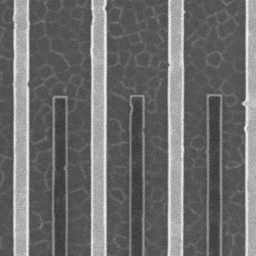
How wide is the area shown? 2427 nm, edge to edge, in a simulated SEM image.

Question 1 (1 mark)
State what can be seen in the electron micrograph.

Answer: parallel lines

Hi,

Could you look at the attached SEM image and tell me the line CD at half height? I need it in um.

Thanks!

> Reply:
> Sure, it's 0.129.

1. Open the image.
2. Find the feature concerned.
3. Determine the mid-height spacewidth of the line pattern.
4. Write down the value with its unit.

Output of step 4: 242 nanometres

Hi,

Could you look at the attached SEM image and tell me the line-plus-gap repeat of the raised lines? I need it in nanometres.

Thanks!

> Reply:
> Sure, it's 366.